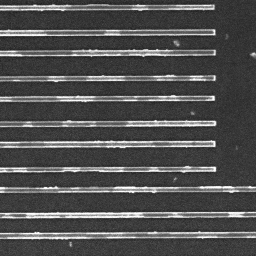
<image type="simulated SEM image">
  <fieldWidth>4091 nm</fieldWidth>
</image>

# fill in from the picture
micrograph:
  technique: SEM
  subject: parallel lines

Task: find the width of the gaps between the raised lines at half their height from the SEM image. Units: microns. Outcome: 0.287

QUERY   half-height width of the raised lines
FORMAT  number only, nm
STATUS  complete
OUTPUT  73.9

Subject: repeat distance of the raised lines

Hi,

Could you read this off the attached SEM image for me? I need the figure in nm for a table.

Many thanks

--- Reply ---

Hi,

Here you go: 364